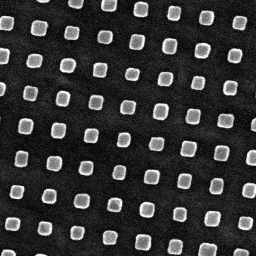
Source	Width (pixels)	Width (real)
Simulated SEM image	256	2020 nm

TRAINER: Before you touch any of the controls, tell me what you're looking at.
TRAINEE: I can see a regular array of raised bodies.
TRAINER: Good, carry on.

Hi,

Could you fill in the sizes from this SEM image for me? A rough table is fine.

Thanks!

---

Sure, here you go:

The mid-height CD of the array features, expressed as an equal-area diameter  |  114 nanometres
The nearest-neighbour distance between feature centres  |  258 nm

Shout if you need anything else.